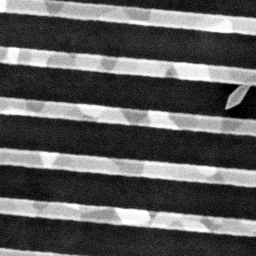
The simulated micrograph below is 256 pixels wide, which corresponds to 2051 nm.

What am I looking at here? lines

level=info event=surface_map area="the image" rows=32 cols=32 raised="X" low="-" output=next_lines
XXXXXXXXXXXX--------------------
-XXXXXXXXXXXXXXXXXXXXXX---------
------------XXXXXXXXXXXXXXXXXXXX
-----------------------XXXXXXXXX
--------------------------------
--------------------------------
XXXXXXX-------------------------
XXXXXXXXXXXXXXXXXX--------------
-------XXXXXXXXXXXXXXXXXXXXXX---
------------------XXXXXXXXXXXXXX
-----------------------------XXX
-----------------------------XX-
XXX--------------------------X--
XXXXXXXXXXXXXX------------------
-----XXXXXXXXXXXXXXXXXXXX-------
----------------XXXXXXXXXXXXXXXX
---------------------------XXXXX
--------------------------------
--------------------------------
XXXXXXXXXXX---------------------
XXXXXXXXXXXXXXXXXXXXXX----------
-----------XXXXXXXXXXXXXXXXXXXXX
----------------------XXXXXXXXXX
--------------------------------
--------------------------------
XXXXXXXX------------------------
XXXXXXXXXXXXXXXXXXX-------------
---------XXXXXXXXXXXXXXXXXXXXX--
--------------------XXXXXXXXXXXX
-------------------------------X
--------------------------------
XXXX----------------------------